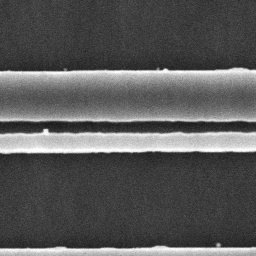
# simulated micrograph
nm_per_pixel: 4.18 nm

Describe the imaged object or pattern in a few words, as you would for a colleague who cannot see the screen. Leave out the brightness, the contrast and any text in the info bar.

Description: lines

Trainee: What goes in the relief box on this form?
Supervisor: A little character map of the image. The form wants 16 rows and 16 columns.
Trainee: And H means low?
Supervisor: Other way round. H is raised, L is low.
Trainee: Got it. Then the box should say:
LLLLLLLLLLLLLLLL
LLLLLLLLLLLLLLLL
LLLLLLLLLLLLLLLL
LLLLLLLLLLLLLLLL
HHHHHHHHHHHHHHHH
HHHHHHHHHHHHHHHH
HHHHHHHHHHHHHHHH
HHHHHHHHHHHHHHHH
HHHHHHHHHHHHHHHH
LLLLLLLLLLLLLLLL
LLLLLLLLLLLLLLLL
LLLLLLLLLLLLLLLL
LLLLLLLLLLLLLLLL
LLLLLLLLLLLLLLLL
LLLLLLLLLLLLLLLL
LLLHLLLLLHHLLLLL